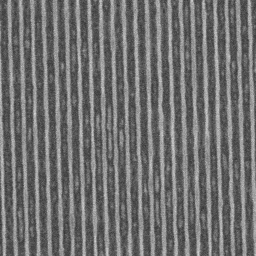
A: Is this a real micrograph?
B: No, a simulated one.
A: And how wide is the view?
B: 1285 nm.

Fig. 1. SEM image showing parallel lines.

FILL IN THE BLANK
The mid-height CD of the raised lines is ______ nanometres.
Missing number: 16.9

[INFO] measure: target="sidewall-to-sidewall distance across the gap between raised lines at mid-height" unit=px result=8.51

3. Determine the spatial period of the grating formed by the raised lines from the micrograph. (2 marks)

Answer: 57.4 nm